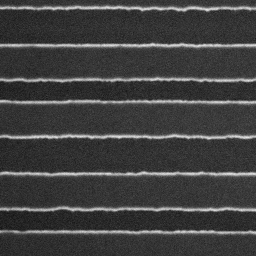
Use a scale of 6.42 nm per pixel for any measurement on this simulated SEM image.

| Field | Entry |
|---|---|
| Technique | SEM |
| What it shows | lines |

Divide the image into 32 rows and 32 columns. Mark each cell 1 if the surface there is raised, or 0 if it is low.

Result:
11111111111111111111111111111111
00000000000000000000000000000000
00000000000000000000000000000000
00000000000000000000000000000000
00000000000000000000000000000000
00000000000000000001000000000000
11111111111111111111111111111111
11111111111111111111111111111111
11111111111111111111111111111111
11111111111111111111111111111111
00000000000000000000000000000000
00000000000000000000000000000000
00000000000000000000000000000000
11111111111111111111111111111111
11111111111111111111111111111111
11111111111111111111111111111111
11111111111111111111111111111111
00000000000000000000000000000000
00000000000000000000000000000000
00000000000000000000000000000000
00000000000000000000000000000000
00000000000000000000000000000000
11111111111111111111111111111111
11111111111111111111111111111111
11111111111111111111111111111111
11111111111111111111111111111111
00000000000000000000000000000000
00000000000000000000000000000000
00000000000000000000000000000000
11111111111111111111111111111111
11111111111111111111111111111111
11111111111111111111111111111111